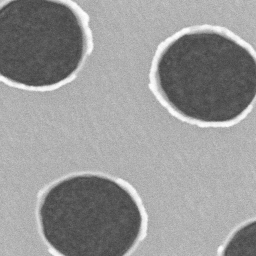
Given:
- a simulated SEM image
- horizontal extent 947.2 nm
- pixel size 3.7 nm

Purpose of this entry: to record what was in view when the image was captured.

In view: holes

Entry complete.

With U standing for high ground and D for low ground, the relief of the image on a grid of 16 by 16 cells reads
DDDDUUUUUUUUUUUU
DDDDDUUUUUUUUUUU
DDDDDUUUUUUDDDDU
DDDDDUUUUUDDDDDD
DDDDDUUUUUDDDDDD
UUUUUUUUUUDDDDDD
UUUUUUUUUUUDDDDD
UUUUUUUUUUUUUDUU
UUUUUUUUUUUUUUUU
UUUUUUUUUUUUUUUU
UUUUUUUUUUUUUUUU
UUUUDDDUUUUUUUUU
UUUDDDDDUUUUUUUU
UUDDDDDDDUUUUUUU
UUUDDDDDDUUUUUUD
UUUDDDDDUUUUUUDD